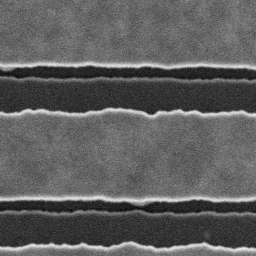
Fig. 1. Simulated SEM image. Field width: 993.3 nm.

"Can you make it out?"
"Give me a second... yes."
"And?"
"lines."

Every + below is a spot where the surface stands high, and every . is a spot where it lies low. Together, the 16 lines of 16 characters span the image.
++++++++++++++++
++++++++++++++++
++++++++++++++++
++++++++++++++++
................
................
................
++++++++++++++++
++++++++++++++++
++++++++++++++++
++++++++++++++++
++++++++++++++++
++++..++++++.+++
................
................
++++++++++++++..